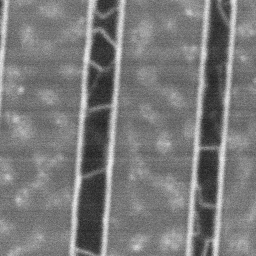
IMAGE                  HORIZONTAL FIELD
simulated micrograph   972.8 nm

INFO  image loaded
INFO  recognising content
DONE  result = one or a few lines or trenches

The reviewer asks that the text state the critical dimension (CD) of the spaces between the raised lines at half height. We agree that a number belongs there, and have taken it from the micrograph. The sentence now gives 317 nm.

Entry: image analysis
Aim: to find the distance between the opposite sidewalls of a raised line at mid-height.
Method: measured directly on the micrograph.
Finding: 109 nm